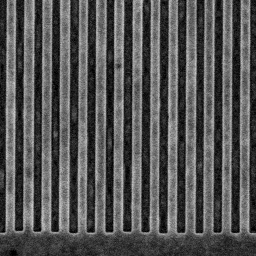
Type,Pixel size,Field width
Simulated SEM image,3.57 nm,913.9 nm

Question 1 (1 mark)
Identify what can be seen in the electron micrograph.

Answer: parallel lines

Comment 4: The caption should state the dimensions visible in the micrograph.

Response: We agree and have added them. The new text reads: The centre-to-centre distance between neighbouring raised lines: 64.3 nm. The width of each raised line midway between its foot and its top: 33.9 nm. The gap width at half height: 31.2 nm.